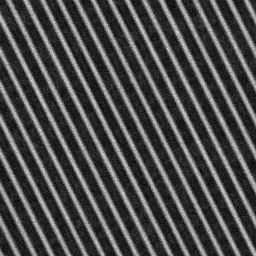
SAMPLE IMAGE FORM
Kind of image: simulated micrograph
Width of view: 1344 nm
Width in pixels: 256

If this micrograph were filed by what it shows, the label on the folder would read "parallel lines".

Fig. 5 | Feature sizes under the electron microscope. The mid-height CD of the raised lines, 28.7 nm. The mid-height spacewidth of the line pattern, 10.3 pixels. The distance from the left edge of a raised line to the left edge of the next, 79.6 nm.